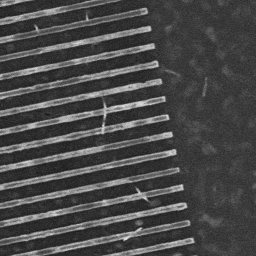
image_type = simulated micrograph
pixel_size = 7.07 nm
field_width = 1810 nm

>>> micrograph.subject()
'parallel lines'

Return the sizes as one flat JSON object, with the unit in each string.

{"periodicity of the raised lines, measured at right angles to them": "0.127 µm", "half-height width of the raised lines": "0.039 µm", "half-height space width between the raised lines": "91 nm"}